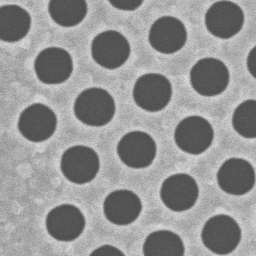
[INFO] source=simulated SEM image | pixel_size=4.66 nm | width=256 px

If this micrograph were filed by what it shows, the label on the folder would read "a regular array of holes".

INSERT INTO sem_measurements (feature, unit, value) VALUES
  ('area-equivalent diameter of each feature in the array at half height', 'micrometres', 0.182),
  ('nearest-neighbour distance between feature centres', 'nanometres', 275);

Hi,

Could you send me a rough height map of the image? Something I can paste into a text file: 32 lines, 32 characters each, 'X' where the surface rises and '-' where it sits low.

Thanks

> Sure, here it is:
XXXXXX-----XXX----XXXXXXXXX--XXX
---XXX-----XXXXXXXXXXXXXXX----XX
----XXX---XXXXXXXXXX--XXXX-----X
----XXXXXXXXXXXXXXX----XXX----XX
---XXXXXXXXX---XXXX----XXXX--XXX
XXXXXXXXXXX-----XXX----XXXXXXXXX
XXXXX---XXX-----XXXX--XXXXXXXXX-
XXXX-----XXX----XXXXXXXXX--XXXX-
XXXX-----XXXX--XXXXXXXXX----XXX-
XXXXX----XXXXXXXXX---XXX-----XXX
XXXXXX-XXXXXXXXXX----XXX-----XXX
XXXXXXXXXX---XXXX----XXXX---XXXX
XXXXXXXXX-----XXX----XXXXXXXXXX-
XXX---XXX-----XXXX--XXXXXXXXXX--
XX-----XX-----XXXXXXXXXX-XXXX---
XX-----XXXX--XXXXXXXXX----XXX---
XX-----XXXXXXXXX--XXXX-----XXX--
XXXX--XXXXXXXXX----XXX-----XXXXX
XXXXXXXXX--XXXX-----XX----XXXXXX
XXXXXXXX----XXX----XXXXXXXXXXXXX
XXXXXXXX----XXXX---XXXXXXXXX---X
XXXXXXXX----XXXXXXXXXXXXXXX-----
XXXXXXXXX---XXXXXXXXX---XXX-----
XXXXXXXXXXXXXXXXXXXX-----XXX----
XXXXXXXXXXXXX----XXX-----XXXXXXX
XXXXXXXX-XXXX-----XXX---XXXXXXXX
XXXXXX----XXX-----XXXXXXXXXXXXXX
XXXXXX-----XXX---XXXXXXXXX---XXX
XXXXXX-----XXXXXXXXXXXXXX-----XX
XXXXXX----XXXXXXXX----XXX-----XX
XXXXXXXXXXXXXXXXXX-----XX-----XX
XXXXXXXXXXX----XXX-----XXX---XXX